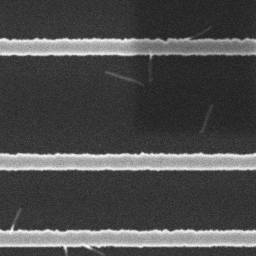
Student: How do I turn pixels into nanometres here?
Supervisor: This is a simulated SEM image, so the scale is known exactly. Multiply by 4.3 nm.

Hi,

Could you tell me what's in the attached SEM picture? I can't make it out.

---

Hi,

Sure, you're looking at lines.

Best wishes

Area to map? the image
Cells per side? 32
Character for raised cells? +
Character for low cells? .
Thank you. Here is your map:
................................
................................
................................
................................
................................
++++++++++++++++++++++++++++++++
++++++++++++++++++++++++++++++++
................................
................................
................................
................................
................................
................................
................................
................................
................................
................................
................................
................................
++++++++++++++++++++++++++++++++
++++++++++++++++++++++++++++++++
................................
................................
................................
................................
................................
................................
................................
................................
++++++++++++++++++++++++++++++++
++++++++++++++++++++++++++++++++
................................